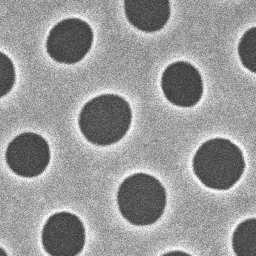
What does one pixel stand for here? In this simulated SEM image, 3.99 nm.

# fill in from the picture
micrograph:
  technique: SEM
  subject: holes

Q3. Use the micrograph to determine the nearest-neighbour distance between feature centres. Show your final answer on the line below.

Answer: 338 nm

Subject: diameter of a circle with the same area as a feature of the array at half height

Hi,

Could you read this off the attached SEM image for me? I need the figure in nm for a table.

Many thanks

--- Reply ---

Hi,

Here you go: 196